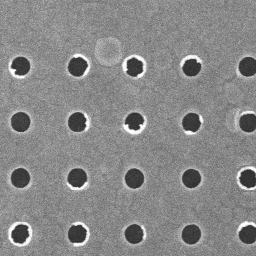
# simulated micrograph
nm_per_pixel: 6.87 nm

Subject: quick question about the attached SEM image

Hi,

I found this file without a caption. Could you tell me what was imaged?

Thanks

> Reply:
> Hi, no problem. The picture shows a regular array of holes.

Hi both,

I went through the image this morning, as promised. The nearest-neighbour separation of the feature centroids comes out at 383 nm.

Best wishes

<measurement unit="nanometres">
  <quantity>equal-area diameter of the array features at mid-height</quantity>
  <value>131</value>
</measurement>